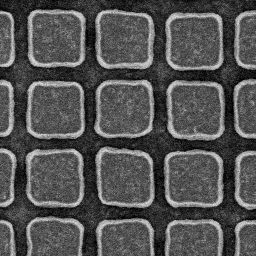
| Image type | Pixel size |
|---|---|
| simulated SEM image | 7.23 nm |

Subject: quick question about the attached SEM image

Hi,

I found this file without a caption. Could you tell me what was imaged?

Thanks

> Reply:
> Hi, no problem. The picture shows a regular array of raised bodies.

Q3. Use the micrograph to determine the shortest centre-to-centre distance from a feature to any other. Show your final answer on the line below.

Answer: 496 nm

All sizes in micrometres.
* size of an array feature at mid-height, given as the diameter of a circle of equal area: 0.435